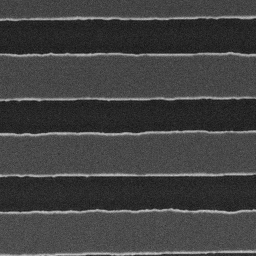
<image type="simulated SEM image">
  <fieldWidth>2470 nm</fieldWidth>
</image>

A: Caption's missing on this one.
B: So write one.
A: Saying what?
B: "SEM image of lines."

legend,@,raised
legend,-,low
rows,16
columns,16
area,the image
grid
@@@@@@@@@@@@@@@@
----------------
----------------
@@@@@@@@@@@@@@@@
@@@@@@@@@@@@@@@@
@@@@@@@@@@@@@@@@
----------------
----------------
@@@@@@@@@@@@@@@@
@@@@@@@@@@@@@@@@
@@@@@@@@@@@@@@@@
----------------
----------------
@@@@@@@@@@@@@@@@
@@@@@@@@@@@@@@@@
@@@@@@@@@@@@@@@@